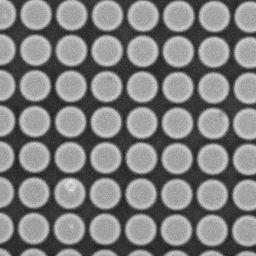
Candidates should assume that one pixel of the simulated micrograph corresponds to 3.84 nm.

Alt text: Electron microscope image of an array of small figures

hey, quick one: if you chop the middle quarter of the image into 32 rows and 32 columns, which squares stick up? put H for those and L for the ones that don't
LLLLLLLLLLLLLLLLLLLHLLLLLLLHHHLL
LLLLLLLLLLLLLLLLLLLLLLLLLLLLLLLL
HHHHLLLLLHHHHLLLLLHHHLLLLLLHHHLL
HHHHHLLLHHHHHHLLLHHHHHHLLLHHHHHL
HHHHHLLHHHHHHHLLHHHHHHHLLHHHHHHH
HHHHHLLHHHHHHHLLHHHHHHHLLHHHHHHH
HHHHHLLHHHHHHHLLHHHHHHHLLHHHHHHH
HHHHHLLHHHHHHHLLHHHHHHHLLHHHHHHH
HHHHLLLLHHHHHLLLLHHHHHLLLLHHHHHL
LLLLLLLLLLLLLLLLLLLLLLLLLLLLHLLL
LLLLLLLLLLLLLLLLLLLLLLLLLLLLLLLL
HHHHLLLLHHHHHLLLLLHHHLLLLLLHHHLL
HHHHHLLHHHHHHHLLLHHHHHHLLHHHHHHL
HHHHHLLHHHHHHHLLHHHHHHHLLHHHHHHH
HHHHHLLHHHHHHHLLHHHHHHHLLHHHHHHH
HHHHHLLHHHHHHHLLHHHHHHHLLHHHHHHH
HHHHHLLHHHHHHHLLHHHHHHHLLHHHHHHH
HHHHLLLLHHHHHLLLLHHHHHLLLLHHHHHL
LLLLLLLLLLLLLLLLLLLLLLLLLLLLLLLL
LLLLLLLLLLLLLLLLLLLLLLLLLLLLLLLL
HHHHLLLLHHHHHLLLLHHHHHLLLLHHHHLL
HHHHHLLHHHHHHHLLHHHHHHHLLHHHHHHL
HHHHHLLHHHHHHHLLHHHHHHHLLHHHHHHH
HHHHHLLHHHHHHHLLHHHHHHHLLHHHHHHH
HHHHHLLHHHHHHHLLHHHHHHHLLHHHHHHH
HHHHHLLHHHHHHHLLHHHHHHHLLHHHHHHL
HHHHLLLLHHHHHLLLLHHHHHLLLLHHHHHL
LLLLLLLLLLLLLLLLLLLLLLLLLLLLLLLL
LLLLLLLLLLLLLLLLLLLLLLLLLLLLLLLL
HHHHLLLLHHHHHLLLLHHHHHLLLLHHHHLL
HHHHHLLHHHHHHHLLHHHHHHLLLHHHHHHL
HHHHHLLHHHHHHHLLHHHHHHHLLHHHHHHH